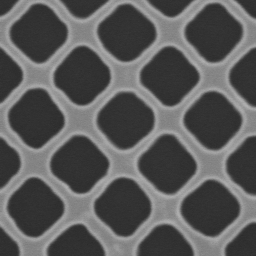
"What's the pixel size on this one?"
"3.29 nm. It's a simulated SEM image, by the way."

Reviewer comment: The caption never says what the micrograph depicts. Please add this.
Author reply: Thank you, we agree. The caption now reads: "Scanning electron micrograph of a regular array of holes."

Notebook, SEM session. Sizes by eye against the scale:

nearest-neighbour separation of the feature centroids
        61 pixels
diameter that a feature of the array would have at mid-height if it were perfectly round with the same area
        180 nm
